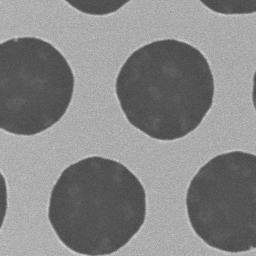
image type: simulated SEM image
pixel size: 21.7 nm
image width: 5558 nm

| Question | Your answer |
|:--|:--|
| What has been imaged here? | holes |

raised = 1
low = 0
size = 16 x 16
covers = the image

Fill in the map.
1111100011111000
1111111111111111
1001111111011111
0000111100000111
0000011000000111
0000011000000111
0000111000000111
0000111100000111
1111111110001111
1111111111111101
1111000011111000
1110000001110000
1110000001110000
1110000001110000
1110000001110000
1111000011111000